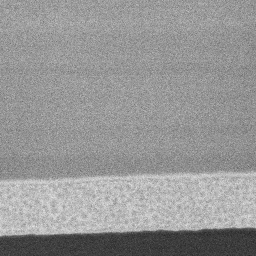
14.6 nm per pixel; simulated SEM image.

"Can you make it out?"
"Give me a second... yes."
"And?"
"one or a few lines or trenches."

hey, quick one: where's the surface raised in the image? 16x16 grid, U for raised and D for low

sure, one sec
DDDDDDDDDDDDDDDD
DDDDDDDDDDDDDDDD
DDDDDDDDDDDDDDDD
DDDDDDDDDDDDDDDD
DDDDDDDDDDDDDDDD
DDDDDDDDDDDDDDDD
DDDDDDDDDDDDDDDD
DDDDDDDDDDDDDDDD
DDDDDDDDDDDDDDDD
DDDDDDDDDDDDDDDD
DDDDDDDDDDDDDDDD
UUUUUUUUUUUUUUUU
UUUUUUUUUUUUUUUU
UUUUUUUUUUUUUUUU
UUUUUUUUDDDDDDDD
DDDDDDDDDDDDDDDD